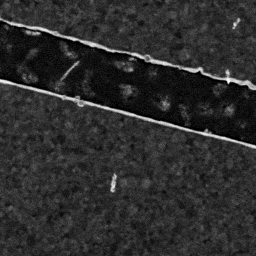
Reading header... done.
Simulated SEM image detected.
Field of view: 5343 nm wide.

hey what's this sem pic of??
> one or a few lines or trenches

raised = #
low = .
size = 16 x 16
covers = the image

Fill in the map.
################
.###############
.....###########
.........#######
.............###
##..............
######..........
#########.......
#############...
################
################
################
################
################
################
################